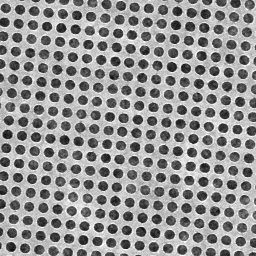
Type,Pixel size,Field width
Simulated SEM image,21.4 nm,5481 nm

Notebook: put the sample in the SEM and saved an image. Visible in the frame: a regular array of holes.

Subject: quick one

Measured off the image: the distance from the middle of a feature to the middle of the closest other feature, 0.295 microns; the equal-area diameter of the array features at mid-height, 0.228 µm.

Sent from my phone